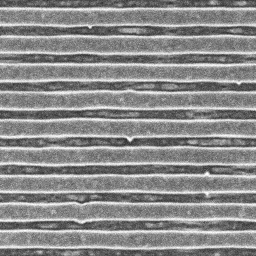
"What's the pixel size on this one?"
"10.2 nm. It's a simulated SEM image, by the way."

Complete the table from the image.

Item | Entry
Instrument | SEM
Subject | parallel lines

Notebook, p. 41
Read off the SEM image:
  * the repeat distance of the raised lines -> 284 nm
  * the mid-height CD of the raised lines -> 180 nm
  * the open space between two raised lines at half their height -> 108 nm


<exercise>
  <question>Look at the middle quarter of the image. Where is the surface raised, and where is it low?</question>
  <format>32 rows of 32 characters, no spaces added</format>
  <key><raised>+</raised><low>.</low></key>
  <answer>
++++++++++++++++++++++++++++++++
++++++++++++++++++++++++++++++++
++++++++++++++++++++++++++++++++
++++++++++++++++++++++++++++++++
................................
................................
................................
++++++++++++++++++++++++++++++++
++++++++++++++++++++++++++++++++
++++++++++++++++++++++++++++++++
++++++++++++++++++++++++++++++++
................................
................................
................................
++++++++++++++++++++++++++++++++
++++++++++++++++++++++++++++++++
++++++++++++++++++++++++++++++++
++++++++++++++++++++++++++++++++
................+...............
................................
................................
++++++++++++++++++++++++++++++++
++++++++++++++++++++++++++++++++
++++++++++++++++++++++++++++++++
++++++++++++++++++++++++++++++++
................................
................................
................................
++++++++++++++++++++++++++++++++
++++++++++++++++++++++++++++++++
++++++++++++++++++++++++++++++++
++++++++++++++++++++++++++++++++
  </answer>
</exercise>